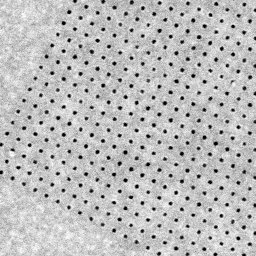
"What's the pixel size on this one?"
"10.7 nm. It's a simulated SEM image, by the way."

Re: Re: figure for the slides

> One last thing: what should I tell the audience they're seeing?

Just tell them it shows a regular array of holes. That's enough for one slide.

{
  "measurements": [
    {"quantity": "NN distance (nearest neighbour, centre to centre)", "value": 131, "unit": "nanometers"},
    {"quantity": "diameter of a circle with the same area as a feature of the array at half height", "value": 54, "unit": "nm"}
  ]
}